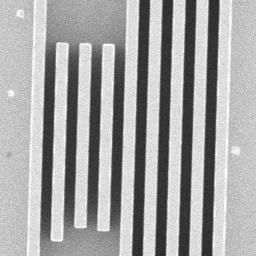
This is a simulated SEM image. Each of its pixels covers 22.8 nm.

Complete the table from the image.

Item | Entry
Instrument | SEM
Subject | groups of lines, slits or small figures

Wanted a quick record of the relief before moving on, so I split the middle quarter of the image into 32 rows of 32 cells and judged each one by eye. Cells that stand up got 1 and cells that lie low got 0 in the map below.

10001110001100001100011100011100
10001110001100011100011100011100
10001110001100011100011100011100
10001100001100011100011100011100
10001100001100011100011100011100
10001100011100011100011100011100
10001100011100011100011100011000
10001100011100011100011100011000
10001100011100011100011100011000
10001100011100011100011100011000
10001100011100011100011100011000
10001100011100011100011100011000
10001100011100011100011100011000
10001100011100011100011100011000
00001100011100011100011100011000
00011100011100011100011100011000
00011100011100011100011100011000
00011100011100011100011000011000
00011100011100011100011000111000
00011100011100011100011000111000
00011100011100011000011000111000
00011100011100011000011000111000
00011100011100011000011000111000
00011100011100011000011000111000
00011100011100011000011000111000
00011100011100011000011000111000
00011100011100011000011000111000
00011100011100011000011000111000
00011100011100011000011000111000
00011100011100011000111000111000
00011100011000011000111000111000
00011100011000011000111000111000